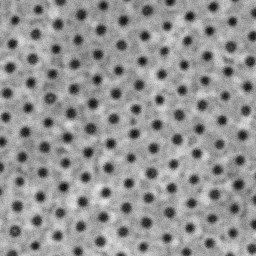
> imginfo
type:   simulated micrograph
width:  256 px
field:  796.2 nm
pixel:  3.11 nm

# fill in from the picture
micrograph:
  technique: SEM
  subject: a regular array of holes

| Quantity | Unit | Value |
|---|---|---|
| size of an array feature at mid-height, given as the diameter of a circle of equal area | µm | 0.0307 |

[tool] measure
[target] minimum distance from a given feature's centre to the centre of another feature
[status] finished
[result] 0.0753 micrometres